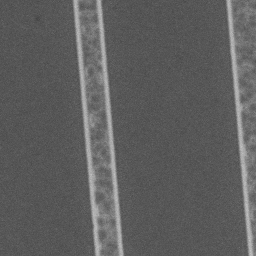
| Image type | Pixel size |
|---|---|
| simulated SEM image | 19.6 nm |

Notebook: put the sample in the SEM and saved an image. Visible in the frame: one or a few lines or trenches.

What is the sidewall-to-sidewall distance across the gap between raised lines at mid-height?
2530 nanometers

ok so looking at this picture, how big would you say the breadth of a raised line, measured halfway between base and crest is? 24.3 pixels